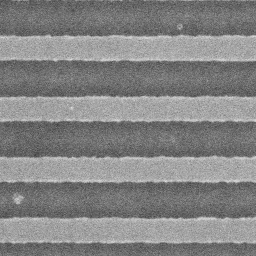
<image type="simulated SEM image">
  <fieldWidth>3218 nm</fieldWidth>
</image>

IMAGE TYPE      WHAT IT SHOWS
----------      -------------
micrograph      lines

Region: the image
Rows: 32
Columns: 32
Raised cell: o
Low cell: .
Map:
................................
................................
................................
................................
......................o.........
oooooooooooooooooooooooooooooooo
oooooooooooooooooooooooooooooooo
....o.ooo.ooooo.oooooooooooooooo
................................
................................
................................
................................
oooooooooooooooooooooooooooooooo
oooooooooooooooooooooooooooooooo
oooooooooooooooooooooooooooooooo
................................
................................
................................
................................
................................
oooooooooooooooooooooooooooooooo
oooooooooooooooooooooooooooooooo
oooooooooooooooooooooooooooooooo
................................
................................
................................
................................
oooooooooooooooooooooooooooooooo
oooooooooooooooooooooooooooooooo
oooooooooooooooooooooooooooooooo
................................
................................